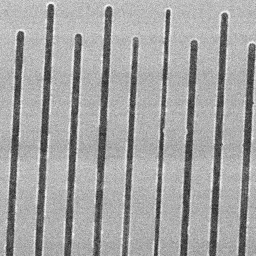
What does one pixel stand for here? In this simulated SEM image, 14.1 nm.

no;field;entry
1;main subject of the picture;parallel lines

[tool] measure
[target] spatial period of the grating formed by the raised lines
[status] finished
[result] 408 nm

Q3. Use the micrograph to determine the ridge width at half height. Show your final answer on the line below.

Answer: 298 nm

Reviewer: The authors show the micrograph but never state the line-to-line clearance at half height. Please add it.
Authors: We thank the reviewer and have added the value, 104 nm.